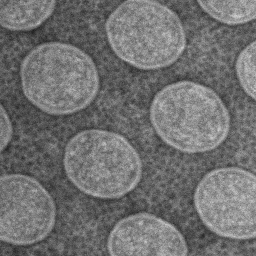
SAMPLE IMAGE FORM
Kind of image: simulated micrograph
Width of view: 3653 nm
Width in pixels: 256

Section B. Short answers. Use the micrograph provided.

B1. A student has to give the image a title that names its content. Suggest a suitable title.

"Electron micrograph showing raised bodies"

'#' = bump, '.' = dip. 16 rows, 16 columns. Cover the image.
###....###...###
##.....####.....
.......#####....
..###..####....#
.#####.........#
.#####....###..#
..###.....####..
#.........####..
#....##...####..
....####........
....#####.......
##...###.....###
###.........####
###.....#....###
###....####...##
.......#####....